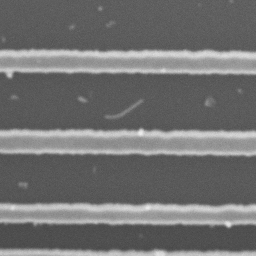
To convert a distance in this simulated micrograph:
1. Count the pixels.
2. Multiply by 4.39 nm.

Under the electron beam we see lines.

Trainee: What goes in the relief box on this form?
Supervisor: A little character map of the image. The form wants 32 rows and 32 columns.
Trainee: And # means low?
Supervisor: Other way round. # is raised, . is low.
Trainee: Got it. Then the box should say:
................................
................................
................................
................................
................................
................................
##########......................
################################
################################
................................
................................
................................
................................
................................
................................
................................
#############..###.#............
################################
################################
................................
................................
................................
................................
................................
................................
................................
################################
################################
................................
................................
................................
##########....#....#............